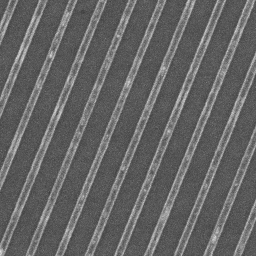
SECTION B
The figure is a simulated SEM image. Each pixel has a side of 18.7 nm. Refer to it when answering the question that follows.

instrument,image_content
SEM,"parallel lines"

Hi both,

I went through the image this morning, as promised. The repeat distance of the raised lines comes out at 514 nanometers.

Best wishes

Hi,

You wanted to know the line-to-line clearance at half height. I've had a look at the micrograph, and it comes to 392 nanometres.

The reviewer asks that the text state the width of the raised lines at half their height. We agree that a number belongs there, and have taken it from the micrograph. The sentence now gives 0.126 um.